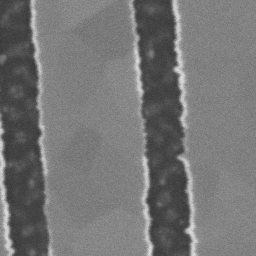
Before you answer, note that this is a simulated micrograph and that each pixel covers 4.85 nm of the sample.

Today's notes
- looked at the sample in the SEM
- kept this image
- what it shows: one or a few lines or trenches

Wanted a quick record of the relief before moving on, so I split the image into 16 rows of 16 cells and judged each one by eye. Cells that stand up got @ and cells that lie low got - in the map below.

--@@@@@@---@@@@@
--@@@@@@---@@@@@
--@@@@@@@--@@@@@
--@@@@@@@--@@@@@
--@@@@@@@--@@@@@
--@@@@@@@--@@@@@
--@@@@@@@--@@@@@
--@@@@@@@--@@@@@
---@@@@@@---@@@@
---@@@@@@--@@@@@
---@@@@@@---@@@@
---@@@@@@---@@@@
---@@@@@@---@@@@
@--@@@@@@---@@@@
@--@@@@@@---@@@@
@--@@@@@@---@@@@